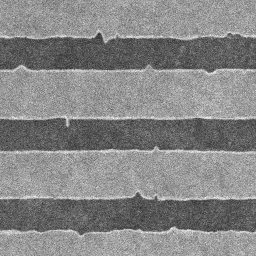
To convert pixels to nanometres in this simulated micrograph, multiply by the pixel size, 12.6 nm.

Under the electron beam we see one or a few lines or trenches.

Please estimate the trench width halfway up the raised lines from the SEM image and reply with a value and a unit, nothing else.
419 nm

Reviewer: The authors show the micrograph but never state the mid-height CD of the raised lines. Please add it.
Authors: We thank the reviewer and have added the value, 605 nm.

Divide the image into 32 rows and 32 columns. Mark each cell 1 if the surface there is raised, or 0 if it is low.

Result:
11111111111111111111111111111111
11111111111111111111111111111111
11111111111111111111111111111111
11111111111111111111111111111111
11111111111101111111111111110000
00000000000000000000000000000000
00000000000000000000000000000000
00000000000000000000000000000000
00100000000000000010000000000000
11111111111111111111111111111111
11111111111111111111111111111111
11111111111111111111111111111111
11111111111111111111111111111111
11111111111111111111111111111111
11111111111111111111111111111111
00000000000000000000000000000000
00000000000000000000000000000000
00000000000000000000000000000000
00000000000000000000000000000000
11111111111111111111111111111111
11111111111111111111111111111111
11111111111111111111111111111111
11111111111111111111111111111111
11111111111111111111111111111111
11111111111111111011111111111111
00000000000000000000000000000000
00000000000000000000000000000000
00000000000000000000000000000000
00000000000000000000010000000000
11111111111111111111111111111111
11111111111111111111111111111111
11111111111111111111111111111111